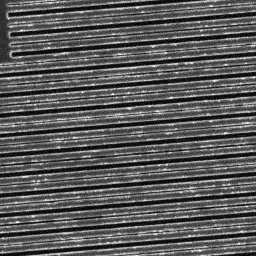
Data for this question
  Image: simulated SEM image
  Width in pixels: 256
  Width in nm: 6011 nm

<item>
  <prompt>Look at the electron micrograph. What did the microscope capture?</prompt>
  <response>parallel lines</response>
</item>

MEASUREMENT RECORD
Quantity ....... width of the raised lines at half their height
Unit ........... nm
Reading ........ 155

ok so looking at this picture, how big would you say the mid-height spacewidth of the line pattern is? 108 nm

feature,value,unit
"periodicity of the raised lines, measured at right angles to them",0.234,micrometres